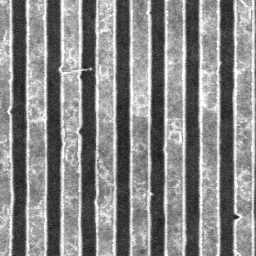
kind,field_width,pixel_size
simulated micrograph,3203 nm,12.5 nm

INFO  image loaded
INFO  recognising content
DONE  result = parallel lines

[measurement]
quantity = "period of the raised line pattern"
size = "433 nm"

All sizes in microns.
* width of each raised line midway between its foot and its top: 0.239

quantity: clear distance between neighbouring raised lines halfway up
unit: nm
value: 194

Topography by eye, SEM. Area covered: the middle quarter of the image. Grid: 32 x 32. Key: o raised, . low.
oooo....ooooo....oooo.....oooo..
oooo....ooooo....oooo.....oooo..
oooo....ooooo....oooo.....oooo..
oooo....ooooo....oooo.....oooo..
oooo....ooooo....oooo.....oooo..
oooo....ooooo....oooo.....oooo..
oooo....ooooo....oooo.....oooo..
oooo....ooooo....oooo.....oooo..
oooo....ooooo....oooo.....oooo..
oooo....ooooo....oooo....ooooo..
oooo....ooooo....oooo....ooooo..
oooo....ooooo....oooo....ooooo..
oooo....ooooo....oooo....ooooo..
oooo....ooooo....oooo.....oooo..
oooo....ooooo....oooo....ooooo..
oooo....ooooo....oooo....ooooo..
oooo....ooooo....oooo.....oooo..
oooo....ooooo....oooo.....oooo..
oooo....ooooo....oooo....ooooo..
oooo....ooooo....oooo....ooooo..
oooo....ooooo....oooo....ooooo..
oooo....ooooo....oooo....ooooo..
oooo....ooooo....oooo....ooooo..
oooo....ooooo....oooo....ooooo..
oooo....ooooo....oooo....ooooo..
oooo....ooooo....oooo....ooooo..
oooo....ooooo....oooo.....oooo..
oooo....ooooo....oooo....ooooo..
oooo....ooooo....oooo.....oooo..
oooo....ooooo....oooo.....oooo..
oooo....ooooo....oooo....ooooo..
oooo....ooooo....oooo....ooooo..